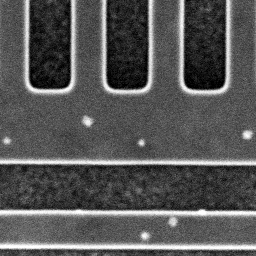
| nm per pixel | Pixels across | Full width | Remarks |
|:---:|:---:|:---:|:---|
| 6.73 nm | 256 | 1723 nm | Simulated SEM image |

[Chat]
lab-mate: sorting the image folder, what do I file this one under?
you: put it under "groups of lines, slits or small figures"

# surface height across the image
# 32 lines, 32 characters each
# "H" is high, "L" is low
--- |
HHHLLLLLLHHHHLLLLLLHHHHLLLLLHHHH
HHHLLLLLLHHHHLLLLLLHHHHLLLLLHHHH
HHHLLLLLLHHHHLLLLLLHHHHLLLLLHHHH
HHHLLLLLLHHHHLLLLLLHHHHLLLLLHHHH
HHHLLLLLLHHHHLLLLLLHHHHLLLLLHHHH
HHHLLLLLLHHHHLLLLLLHHHHLLLLLHHHH
HHHLLLLLLHHHHLLLLLLHHHHLLLLLHHHH
HHHLLLLLLHHHHLLLLLLHHHHLLLLLHHHH
HHHLLLLLLHHHHLLLLLLHHHHLLLLLHHHH
HHHLLLLLLHHHHLLLLLLHHHHLLLLLHHHH
HHHHLLLLLHHHHLLLLLLHHHHLLLLLHHHH
HHHHHHHHHHHHHHHHHHHHHHHHHHHHHHHH
HHHHHHHHHHHHHHHHHHHHHHHHHHHHHHHH
HHHHHHHHHHHHHHHHHHHHHHHHHHHHHHHH
HHHHHHHHHHHHHHHHHHHHHHHHHHHHHHHH
HHHHHHHHHHHHHHHHHHHHHHHHHHHHHHHH
HHHHHHHHHHHHHHHHHHHHHHHHHHHHHHHH
HHHHHHHHHHHHHHHHHHHHHHHHHHHHHHHH
HHHHHHHHHHHHHHHHHHHHHHHHHHHHHHHH
HHHHHHHHHHHHHHHHHHHHHHHHHHHHHHHH
LLLLLLLLLLLLLLLLLLLLLLLLLLHHHHHH
LLLLLLLLLLLLLLLLLLLLLLLLLLLLLLLL
LLLLLLLLLLLLLLLLLLLLLLLLLLLLLLLL
LLLLLLLLLLLLLLLLLLLLLLLLLLLLLLLL
LLLLLLLLLLLLLLLLLLLLLLLLLLLLLLLL
LLLLLLLLLLLLLLLLLLLLLLLLLLLLLLLL
HHHHHHHHHHHHHHHHHHHHHHLLLHLLLLLL
HHHHHHHHHHHHHHHHHHHHHHHHHHHHHHHH
HHHHHHHHHHHHHHHHHHHHHHHHHHHHHHHH
HHHHHHHHHHHHHHHHHHHHHHHHHHHHHHHH
HHHHHHHHHHHHHHHHHHHHHHHHHHHHHHHH
LLLLLLLLLLLLLLLLLLLLLLLLLLLLLLLL